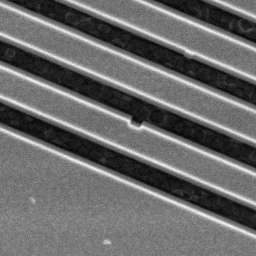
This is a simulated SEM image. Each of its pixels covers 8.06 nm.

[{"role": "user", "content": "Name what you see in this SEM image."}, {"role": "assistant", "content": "parallel lines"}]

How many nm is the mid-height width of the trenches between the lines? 204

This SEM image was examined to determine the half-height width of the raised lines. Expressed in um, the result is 0.259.